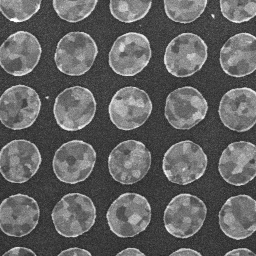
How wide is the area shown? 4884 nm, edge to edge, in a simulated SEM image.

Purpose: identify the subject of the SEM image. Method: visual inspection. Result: a regular array of raised bodies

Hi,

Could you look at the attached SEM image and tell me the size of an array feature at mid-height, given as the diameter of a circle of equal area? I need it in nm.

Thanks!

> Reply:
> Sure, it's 803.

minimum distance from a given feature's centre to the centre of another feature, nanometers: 1020